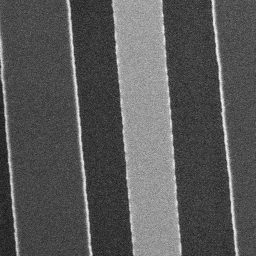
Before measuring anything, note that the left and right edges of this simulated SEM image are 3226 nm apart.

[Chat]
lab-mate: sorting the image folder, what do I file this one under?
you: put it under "lines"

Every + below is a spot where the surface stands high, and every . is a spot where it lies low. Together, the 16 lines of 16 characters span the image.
++++...+++...+++
++++...+++...+++
+++++..+++...+++
+++++..+++....++
+++++..+++....++
+++++...+++...++
+++++...+++...++
+++++...+++...++
+++++...+++...++
+++++...+++...++
.++++...+++...++
.++++...+++...++
.++++...+++...++
.+++++..+++...++
.+++++..+++....+
.+++++..+++....+